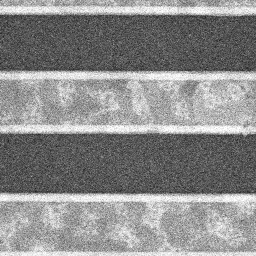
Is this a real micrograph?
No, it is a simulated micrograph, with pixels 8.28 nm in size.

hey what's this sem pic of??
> one or a few lines or trenches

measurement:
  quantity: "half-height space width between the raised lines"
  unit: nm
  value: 553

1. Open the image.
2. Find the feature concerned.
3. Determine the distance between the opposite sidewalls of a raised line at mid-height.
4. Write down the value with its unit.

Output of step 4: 54.1 pixels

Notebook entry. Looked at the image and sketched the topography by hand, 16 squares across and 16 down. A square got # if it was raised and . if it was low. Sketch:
################
................
................
................
................
################
################
################
................
................
................
................
################
################
################
################